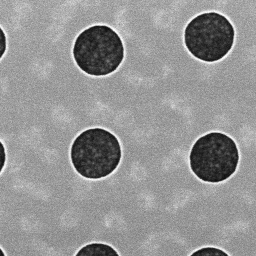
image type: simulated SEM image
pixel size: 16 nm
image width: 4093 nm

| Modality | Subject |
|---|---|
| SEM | holes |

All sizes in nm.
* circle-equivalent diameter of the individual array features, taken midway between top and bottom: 804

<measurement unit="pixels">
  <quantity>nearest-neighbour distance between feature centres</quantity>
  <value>107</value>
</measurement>